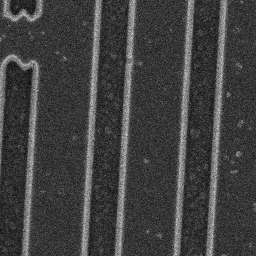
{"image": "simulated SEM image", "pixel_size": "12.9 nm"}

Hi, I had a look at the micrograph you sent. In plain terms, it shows one or a few lines or trenches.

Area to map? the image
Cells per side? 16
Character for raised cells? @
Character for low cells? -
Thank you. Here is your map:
@-@@@@--@@@@--@@
@@@@@@--@@@@--@@
@@@@@@--@@@@--@@
@@@@@@--@@@@--@@
--@@@@--@@@@--@@
--@@@@--@@@@--@@
--@@@@--@@@@--@@
--@@@@--@@@@--@@
--@@@@--@@@@-@@@
--@@@@--@@@--@@@
--@@@@--@@@--@@@
--@@@@--@@@--@@@
--@@@---@@@--@@@
--@@@--@@@@--@@@
--@@@--@@@@--@@@
--@@@--@@@@--@@@